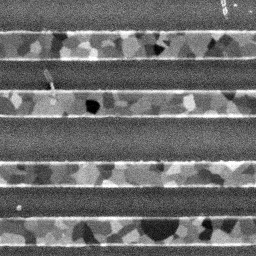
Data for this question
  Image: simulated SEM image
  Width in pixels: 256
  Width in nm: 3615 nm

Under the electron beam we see lines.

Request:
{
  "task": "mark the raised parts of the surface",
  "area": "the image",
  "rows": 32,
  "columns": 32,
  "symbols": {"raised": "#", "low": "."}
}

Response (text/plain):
................................
................................
................................
................................
################################
################################
################################
................................
................................
................................
................................
################################
################################
################################
##############.#################
................................
................................
................................
................................
................................
################################
################################
################################
................................
................................
................................
................................
################################
################################
################################
################################
................................